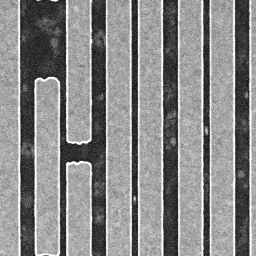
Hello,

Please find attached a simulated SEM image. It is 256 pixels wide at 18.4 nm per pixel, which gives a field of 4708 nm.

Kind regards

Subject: parallel lines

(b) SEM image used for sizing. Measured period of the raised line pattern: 648 nm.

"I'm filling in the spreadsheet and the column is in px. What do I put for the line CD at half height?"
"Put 24.2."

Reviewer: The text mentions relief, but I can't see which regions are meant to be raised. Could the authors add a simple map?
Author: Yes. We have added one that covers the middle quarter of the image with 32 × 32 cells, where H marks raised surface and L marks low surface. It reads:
LHHHHHHLLLLHHHHHHLLHHHHHLLLLLHHH
LHHHHHHLLLLHHHHHHLLHHHHHLLLLLHHH
LHHHHHHLLLLHHHHHHLLHHHHHLLLLLHHH
LHHHHHHLLLLHHHHHHLLHHHHHLLLLLHHH
LHHHHHHLLLLHHHHHHLLHHHHHLLLLLHHH
LHHHHHHLLLLHHHHHHLLHHHHHLLLLLHHH
LHHHHHHLLLLHHHHHHLLHHHHHLLLLLHHH
LHHHHHHLLLLHHHHHHLLHHHHHLLLLLHHH
LHHHHHHLLLLHHHHHHLLHHHHHLLLLLHHH
LHHHHHHLLLLHHHHHHLLHHHHHLLLLLHHH
LHHHHHHLLLLHHHHHHLLHHHHHLLLLLHHH
LHHHHHHLLLLHHHHHHLLHHHHHLLLLLHHH
LHHHHHHLLLLHHHHHHLLHHHHHLLLLLHHH
LHHHHHHLLLLHHHHHHLLHHHHHLLLLLHHH
LHHHHHHLLLLHHHHHHLLHHHHHLLLLLHHH
LHHHHHHLLLLHHHHHHLLHHHHHLLLLLHHH
LHHHHHHLLLLHHHHHHLLHHHHHLLLLLHHH
LHHHHHHLLLLHHHHHHLLHHHHHLLLLLHHH
LHHHHHHLLLLHHHHHHLLHHHHHLLLLLHHH
LHHHHHLLLLLHHHHHHLLHHHHHLLLLLHHH
LLLLLLLLLLLHHHHHHLLHHHHHLLLLLHHH
LLLLLLLLLLLHHHHHHLLHHHHHLLLLLHHH
LLLLLLLLLLLHHHHHHLLHHHHHLLLLLHHH
LLLLLLLLLLLHHHHHHLLHHHHHLLLLLHHH
LLLLLLLLLLLHHHHHHLLHHHHHLLLLLHHH
LHHHHHHLLLLHHHHHHLLHHHHHLLLLLHHH
LHHHHHHLLLLHHHHHHLLHHHHHLLLLLHHH
LHHHHHHLLLLHHHHHHLLHHHHHLLLLLHHH
LHHHHHHLLLLHHHHHHLLHHHHHLLLLLHHH
LHHHHHHLLLLHHHHHHLLHHHHHLLLLLHHH
LHHHHHHLLLLHHHHHHLLHHHHHLLLLLHHH
LHHHHHHLLLLHHHHHHLLHHHHHLLLLLHHH